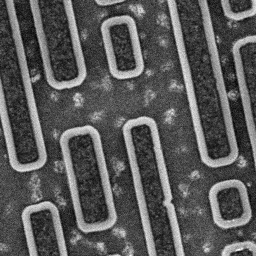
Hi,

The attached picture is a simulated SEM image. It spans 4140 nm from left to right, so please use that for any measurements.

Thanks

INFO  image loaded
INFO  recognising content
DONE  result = one or a few lines or trenches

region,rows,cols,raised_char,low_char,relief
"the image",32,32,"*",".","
*...*****............****...****
**..*****.............****..****
**...****.....**......****......
**...****....****.....****......
**...****....****.....****......
**...*****...****.....*****...**
***..*****....***......****..***
***...****....***......****...**
***...****....***......****...**
***...****.............****...**
***....**...............****..**
****....................****..**
****....................****...*
****....................****...*
****....................****...*
.****...........***......****..*
.****....***....***......****...
.****...****....****.....****...
.****...****....****.....****...
..***...*****...****.....****...
..***...*****....***............
.........****....***............
.........****....****...........
.........****....****......***..
.........*****...****......****.
.........*****....***......****.
...****...****....***......****.
...****...****....****.....****.
...****...........****..........
....****...........***..........
....****...........***..........
....****...........****.....****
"